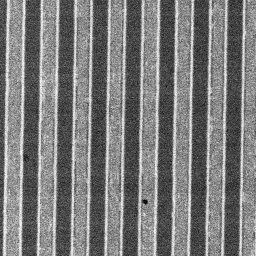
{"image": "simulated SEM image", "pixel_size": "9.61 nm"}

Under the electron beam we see parallel lines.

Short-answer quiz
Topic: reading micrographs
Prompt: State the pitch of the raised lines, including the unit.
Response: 324 nm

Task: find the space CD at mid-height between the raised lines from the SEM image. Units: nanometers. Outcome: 142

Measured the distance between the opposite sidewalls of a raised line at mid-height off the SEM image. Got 18.8 pixels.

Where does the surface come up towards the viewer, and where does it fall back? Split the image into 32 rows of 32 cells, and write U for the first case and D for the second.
UDDUUDDUUDDUUUDDUUDDUUDDUUDDUUUD
UDDUUDDUUDDUUUDDUUDDUUDDUUDDUUDD
UDDUUDDUUDDUUUDDUUDDUUDDUUDDUUDD
UDDUUDDUUDDUUUDDUUDDUUDDUUDDUUUD
UDDUUDDUUDDUUUDDUUDDUUDDUUDDUUUD
UDDUUDDUUDDUUUDDUUDDUUDDUUDDUUDD
UDDUUDDUUDDUUUDDUUDDUUDDUUDDUUDD
UDDUUDDUUDDUUUDDUUDDUUDDUUDDUUDD
UDDUUDDUUDDUUUDDUUDDUUDDUUDDUUDD
UDDUUDDUUDDUUUDDUUDDUUDDUUDDUUDD
UDDUUDDUUDDUUUDDUUDDUUDDUUDDUUDD
UDDUUDDUUDDUUUDDUUDDUUDDUUDDUUDD
UDDUUDDUUDDUUUDUUUDDUUDDUUDDUUDD
UDDUUDDUUDDUUDDUUUDDUUDDUUDDUUDD
UDDUUDDUUDDUUDDUUUDDUUDDUUDDUUDD
UDDUUDDUUDDUUDDUUUDDUUDDUUDDUUDD
UDDUUDDUUDDUUDDUUUDDUUDDUUDDUUDD
UDDUUDDUUDDUUDDUUUDDUUDDUUDDUUDD
UDDUUDDUUDDUUDDUUUDDUUDDUUDDUUDD
UDDUUDDUUDDUUDDUUUDDUUDDUUDDUUDD
UDDUUDDUUDDUUDDUUUDDUUDDUUDDUUDD
UDDUUDDUUDDUUDDUUUDDUUDDUUDDUUDD
UDDUUDDUUDDUUDDUUUDDUUDDUUDDUUDD
UDDUUDDUUDDUUDDUUUDDUUDDUUDDUUDD
UDDUUDDUUDDUUDDUUUDUUUDDUUDDUUDD
UDDUUDDUUDDUUDDUUUDUUUDDUUDDUUDD
UDDUUDDUUDDUUDDUUUDUUUDDUUDDUUDD
UDDUUDDUUDDUUDDUUDDUUUDDUUDDUUDD
UDDUUDDUUDDUUDDUUDDUUUDDUUDDUUDD
UDDUUDDUUDDUUDDUUDDUUUDDUUDDUUDD
UDDUUDDUUDDUUDDUUDDUUUDDUUDDUUDD
UDDUUDDUUDDUUDDUUDDUUUDDUUDDUUDD